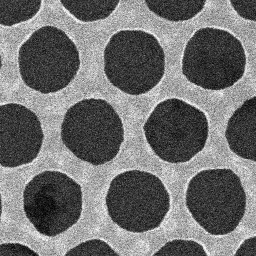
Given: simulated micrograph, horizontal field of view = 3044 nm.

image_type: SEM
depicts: a regular array of holes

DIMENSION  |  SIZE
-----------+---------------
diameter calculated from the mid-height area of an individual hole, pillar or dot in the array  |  0.768 µm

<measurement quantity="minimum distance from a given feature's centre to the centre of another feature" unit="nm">951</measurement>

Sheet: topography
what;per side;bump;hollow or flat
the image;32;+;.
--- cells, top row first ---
.....+++.......+++........+++...
.....+++......+++++......++++...
....++++++..+++++++++...+++++++.
+++++..++++++++++++++++++..+++++
++++.....+++++.....+++++.....+++
+++......++++.......+++.......++
++........+++........++........+
++........+++........++........+
++........+++........++........+
+++......++++.......+++.......++
+++......+++++......++++.....+++
+++++..++++++++...++++++++++++++
++++++++++...+++++++...++++++++.
...++++++.....+++++......+++++..
.....+++.......++++.......+++...
.....+++.......+++........++....
.....+++........++........++....
.....+++.......+++........++....
.....+++.......++++......++++...
.....++++......+++++....++++++..
....+++++++..+++++++++++++++++++
+++++...+++++++....++++++....+++
++++.....+++++......++++......++
+++.......++++.......++.......++
+++.......+++........++........+
+++.......+++........++........+
+++.......+++........+++.......+
++++......++++......++++......++
++++.....++++++.....+++++.....++
++++++.++++++++++++++++++++.++++
...+++++++....+++++++....+++++..
....++++......+++++.......+++...